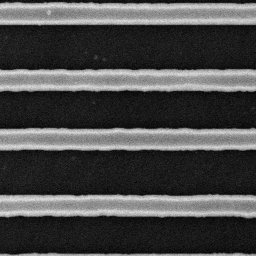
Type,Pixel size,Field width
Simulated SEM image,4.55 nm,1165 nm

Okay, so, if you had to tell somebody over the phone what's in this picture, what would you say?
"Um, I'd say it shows lines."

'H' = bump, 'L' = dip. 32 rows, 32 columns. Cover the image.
HHHLLHHHHHHHLLLLLLLLLLLLLLLLLLLL
HHHHHHHHHHHHHHHHHHHHHHHHHHHHHHHH
HHHHHHHHHHHHHHHHHHHHHHHHHHHHHHHH
LLLLLLLLLLLLLLLLLLLLLLLLLLLLLLLL
LLLLLLLLLLLLLLLLLLLLLLLLLLLLLLLL
LLLLLLLLLLLLLLLLLLLLLLLLLLLLLLLL
LLLLLLLLLLLLLLLLLLLLLLLLLLLLLLLL
LLLLLLLLLLLLLLLLLLLLLLLLLLLLLLLL
LLLLLLLLLLLLLLLLLLLLLLLLLLLLLLLL
HHHHHHHHHHHHHHHHHHHHHHHHHHHHHHHH
HHHHHHHHHHHHHHHHHHHHHHHHHHHHHHHH
LLLLLLLLLLLLLLLLLLLLLLLLLLLLLLLL
LLLLLLLLLLLLLLLLLLLLLLLLLLLLLLLL
LLLLLLLLLLLLLLLLLLLLLLLLLLLLLLLL
LLLLLLLLLLLLLLLLLLLLLLLLLLLLLLLL
LLLLLLLLLLLLLLLLLLLLLLLLLLLLLLLL
HHHHHHHHHHHHHHHHHHHHHHHHHHHHHHHH
HHHHHHHHHHHHHHHHHHHHHHHHHHHHHHHH
HHHHHHHHHHHHHHHHHHHHHHHHHHHHHHHH
LLLLLLLLLLLLLLLLLLLLLLLLLLLLLLLL
LLLLLLLLLLLLLLLLLLLLLLLLLLLLLLLL
LLLLLLLLLLLLLLLLLLLLLLLLLLLLLLLL
LLLLLLLLLLLLLLLLLLLLLLLLLLLLLLLL
LLLLLLLLLLLLLLLLLLLLLLLLLLLLLLLL
LLLLLLLLLLLHLLHLLLLLLLLLLLHLLLLL
HHHHHHHHHHHHHHHHHHHHHHHHHHHHHHHH
HHHHHHHHHHHHHHHHHHHHHHHHHHHHHHHH
LLLLLLLLLLLLLLLLLLLLLLLLLLLLLLLL
LLLLLLLLLLLLLLLLLLLLLLLLLLLLLLLL
LLLLLLLLLLLLLLLLLLLLLLLLLLLLLLLL
LLLLLLLLLLLLLLLLLLLLLLLLLLLLLLLL
LLLLLLLLLLLLLLLLLLLLLLLLLLLLLLLL